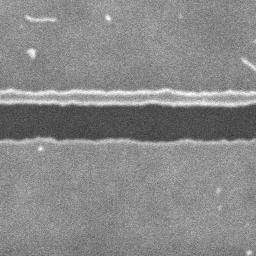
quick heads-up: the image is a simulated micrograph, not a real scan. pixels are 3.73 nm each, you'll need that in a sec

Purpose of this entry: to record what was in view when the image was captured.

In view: lines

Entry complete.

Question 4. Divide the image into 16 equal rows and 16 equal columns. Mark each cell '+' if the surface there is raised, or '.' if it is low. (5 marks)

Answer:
++++++++++++++++
++++++++++++++++
++++++++++++++++
++++++++++++++++
++++++++++++++++
++++++++++++++++
...++++++.++++++
................
................
++++++++++++++++
++++++++++++++++
++++++++++++++++
++++++++++++++++
++++++++++++++++
++++++++++++++++
++++++++++++++++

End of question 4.